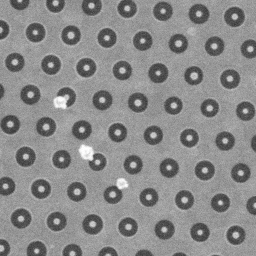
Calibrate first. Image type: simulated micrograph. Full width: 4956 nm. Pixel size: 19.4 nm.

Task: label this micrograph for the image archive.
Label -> an array of small figures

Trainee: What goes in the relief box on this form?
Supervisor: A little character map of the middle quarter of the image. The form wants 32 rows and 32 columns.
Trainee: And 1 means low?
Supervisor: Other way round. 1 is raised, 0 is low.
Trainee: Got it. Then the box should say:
11100000111100000111110000111111
11100000111100000111100000111100
11100000111100000111100000111100
11110001111110001111100000111100
11111111111111111111110001111110
11111111111111111111111111111111
00011111101111111111111111111111
00011110000011111000111111111111
00011110000011110000011111000111
00011110000011110000011110000011
00111110000011110000011110000011
11111111100111111000111110000011
11111111111111111111111111000111
11111111111111111111111111111111
11100011111110111111111111111111
11000001111000011111100111111111
11000001111000001111000001111100
11000001111000001111000001111000
11100011111000011111000001111000
11111111111110111111000011111000
11111111111111111111111111111100
11111111111111111111111111111111
00111110001111111111111111111111
00111110000111100001111111011111
00111100000111100000111100001111
01111100000111100000111100000111
11111110001111100001111100000111
11111111111111110011111100001111
11111111111111111111111111011111
11001111111111111111111111111111
10000111111001111111111111111111
10000011110000111111000111111001